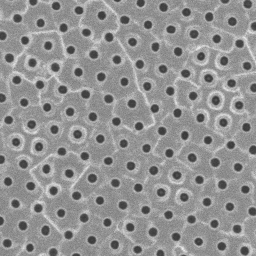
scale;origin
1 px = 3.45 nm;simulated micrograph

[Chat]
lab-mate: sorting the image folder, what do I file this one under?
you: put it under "a regular array of holes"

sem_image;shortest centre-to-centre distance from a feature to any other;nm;79.7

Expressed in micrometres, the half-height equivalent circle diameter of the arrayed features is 0.0309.